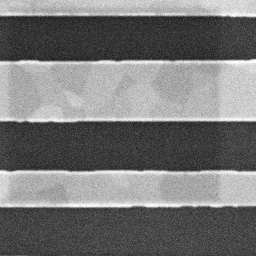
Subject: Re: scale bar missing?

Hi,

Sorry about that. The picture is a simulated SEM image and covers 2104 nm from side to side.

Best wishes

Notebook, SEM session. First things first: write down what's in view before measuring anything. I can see lines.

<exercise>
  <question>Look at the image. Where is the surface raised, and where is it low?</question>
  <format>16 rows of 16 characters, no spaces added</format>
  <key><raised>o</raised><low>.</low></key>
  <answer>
oooooooooooooooo
................
................
................
oooooooooooooooo
oooooooooooooooo
oooooooooooooooo
oooooooooooooooo
................
................
................
oooooooooooooooo
oooooooooooooooo
................
................
................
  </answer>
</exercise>